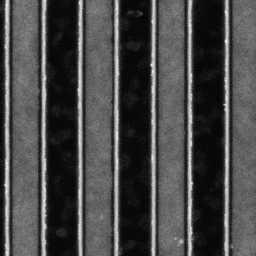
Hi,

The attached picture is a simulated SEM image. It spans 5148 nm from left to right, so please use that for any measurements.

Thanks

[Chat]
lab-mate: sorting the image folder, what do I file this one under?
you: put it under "one or a few lines or trenches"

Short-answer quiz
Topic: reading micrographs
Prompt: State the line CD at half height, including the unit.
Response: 762 nanometers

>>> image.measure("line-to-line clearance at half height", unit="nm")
709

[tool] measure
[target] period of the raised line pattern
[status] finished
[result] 1470 nanometers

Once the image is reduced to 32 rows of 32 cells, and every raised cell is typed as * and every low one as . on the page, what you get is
*....*****.....****.....****....
*....*****.....****.....****....
*....*****.....****.....****....
*....*****.....****.....****....
*....*****.....****.....****....
*....*****.....****.....****....
*....*****.....****.....****....
*....*****.....****.....****....
*....*****.....****.....****....
*....*****.....****.....****....
*....*****.....****.....****....
*....*****.....****.....****....
*....*****.....****.....****....
*....*****.....****.....****....
*....*****.....****.....****....
*....*****.....****.....****....
*....*****.....****.....****....
*....*****.....****.....****....
*....*****.....****.....****....
*....*****....*****.....****....
*....*****....*****.....****....
*....*****....*****.....****....
*....*****....*****.....****....
*....*****....*****.....****....
*....*****....*****.....****....
*....*****....*****.....****....
*....*****....*****.....****....
*....*****....*****.....****....
*....*****....*****.....****....
*....*****....*****.....****....
*....*****....*****.....****....
*....*****....*****.....****....